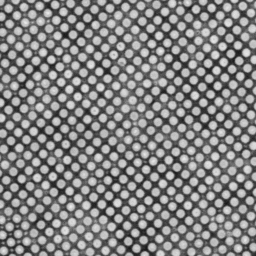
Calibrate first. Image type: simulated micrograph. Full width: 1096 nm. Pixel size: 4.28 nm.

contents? a regular array of raised bodies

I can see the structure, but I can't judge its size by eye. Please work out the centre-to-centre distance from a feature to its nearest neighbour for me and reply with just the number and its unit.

0.0463 microns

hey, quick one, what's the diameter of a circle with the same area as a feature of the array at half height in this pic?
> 8.22 px